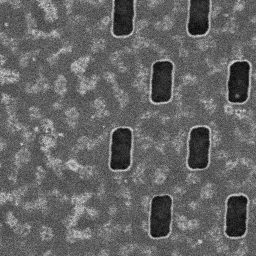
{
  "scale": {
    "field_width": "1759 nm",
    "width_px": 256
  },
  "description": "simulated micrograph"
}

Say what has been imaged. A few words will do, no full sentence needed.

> holes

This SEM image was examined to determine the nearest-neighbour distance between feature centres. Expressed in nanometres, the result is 526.